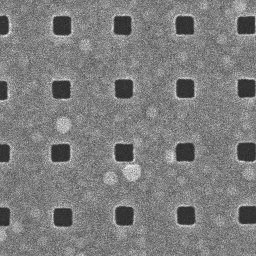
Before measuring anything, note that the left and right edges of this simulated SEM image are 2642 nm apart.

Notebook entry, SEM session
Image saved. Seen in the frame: a regular array of holes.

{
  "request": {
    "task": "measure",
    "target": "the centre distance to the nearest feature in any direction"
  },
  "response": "634 nm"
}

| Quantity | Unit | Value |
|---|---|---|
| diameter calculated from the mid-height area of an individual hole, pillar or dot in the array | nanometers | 216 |